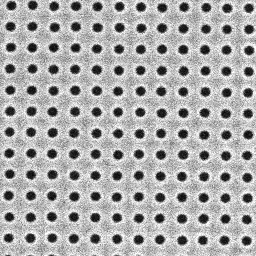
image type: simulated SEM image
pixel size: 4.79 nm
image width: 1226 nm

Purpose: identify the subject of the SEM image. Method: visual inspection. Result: a regular array of holes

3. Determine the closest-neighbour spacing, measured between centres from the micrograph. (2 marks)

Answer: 99.9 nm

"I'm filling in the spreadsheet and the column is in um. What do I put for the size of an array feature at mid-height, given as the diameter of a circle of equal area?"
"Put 0.0483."